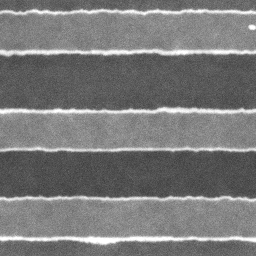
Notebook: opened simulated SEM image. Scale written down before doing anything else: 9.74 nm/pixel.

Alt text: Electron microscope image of lines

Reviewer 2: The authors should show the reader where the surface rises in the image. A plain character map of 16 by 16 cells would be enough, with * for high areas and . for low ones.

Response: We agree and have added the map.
................
****************
****************
................
................
................
................
****************
****************
................
................
................
****************
****************
****************
................